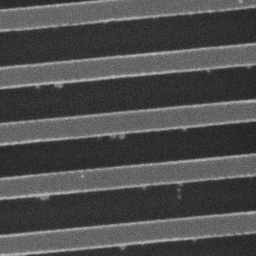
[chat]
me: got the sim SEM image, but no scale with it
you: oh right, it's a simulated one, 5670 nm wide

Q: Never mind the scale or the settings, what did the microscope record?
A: lines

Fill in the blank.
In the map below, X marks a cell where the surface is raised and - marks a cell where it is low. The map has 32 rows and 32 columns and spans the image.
-------XXXXXXXXXXXXXXXXXXXXXXXXX
XXXXXXXXXXXXXXXXXXXXXXXXXX------
XXXXXXXXXXXXXXXX----------------
XXXXXX--------------------------
--------------------------------
--------------------------------
--------------------XXXXXXXXXXXX
----------XXXXXXXXXXXXXXXXXXXXXX
XXXXXXXXXXXXXXXXXXXXXXXXXXXX----
XXXXXXXXXXXXXXXXXX--------------
XXXXXXX-------------------------
--------------------------------
-------------------------------X
--------------------XXXXXXXXXXXX
----------XXXXXXXXXXXXXXXXXXXXXX
XXXXXXXXXXXXXXXXXXXXXXXXXXXX----
XXXXXXXXXXXXXXXXXX--------------
XXXXXXXX------------------------
--------------------------------
-----------------------------XXX
------------------XXXXXXXXXXXXXX
--------XXXXXXXXXXXXXXXXXXXXXXXX
XXXXXXXXXXXXXXXXXXXXXXXXXX------
XXXXXXXXXXXXXXXX----------------
XXXX----------------------------
--------------------------------
-------------------------------X
--------------------XXXXXXXXXXXX
----------XXXXXXXXXXXXXXXXXXXXXX
XXXXXXXXXXXXXXXXXXXXXXXXXXXX----
XXXXXXXXXXXXXXXXX---------------
XXXXXX--------------------------